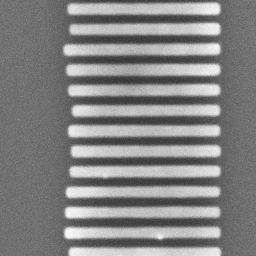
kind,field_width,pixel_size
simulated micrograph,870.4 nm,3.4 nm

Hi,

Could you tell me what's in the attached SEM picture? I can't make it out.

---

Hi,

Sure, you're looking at groups of lines, slits or small figures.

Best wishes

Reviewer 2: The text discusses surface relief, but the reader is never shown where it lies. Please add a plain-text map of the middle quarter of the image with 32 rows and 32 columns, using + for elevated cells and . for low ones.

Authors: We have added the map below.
.+++++++++++++++++++++++++++++++
.+++++++++++++++++++++++++++++++
.+++++++++++++++++++++++++++++++
................................
................................
........++++++++++++++++++++++++
.+++++++++++++++++++++++++++++++
..++++++++++++++++++++++++++++++
................................
................................
....++++++++++++++++++++++++++++
..++++++++++++++++++++++++++++++
..++++++++++++++++++++++++++++++
................................
................................
................................
.+++++++++++++++++++++++++++++++
.+++++++++++++++++++++++++++++++
................................
................................
................................
..++++++++++++++++++++++++++++++
..++++++++++++++++++++++++++++++
................................
................................
................................
..++++++++++++++++++++++++++++++
..++++++++++++++++++++++++++++++
................................
................................
................................
.+++++++++++++++++++++++++++++++